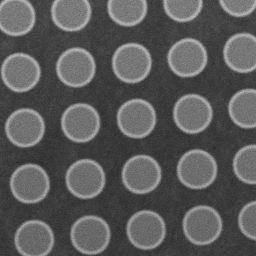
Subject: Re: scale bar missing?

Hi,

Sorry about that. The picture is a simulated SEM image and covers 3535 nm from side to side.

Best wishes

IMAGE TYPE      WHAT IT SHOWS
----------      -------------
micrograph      an array of small figures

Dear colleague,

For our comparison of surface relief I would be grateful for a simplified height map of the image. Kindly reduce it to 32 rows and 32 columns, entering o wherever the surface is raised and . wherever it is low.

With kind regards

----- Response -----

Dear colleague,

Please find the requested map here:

oooo...oooo..ooooo..ooooo...oooo
oooo..ooooo...oooo...oooo...ooo.
oooo...oooo...oooo....oo........
oooo...ooo......................
.............................ooo
................o.....ooo...oooo
........ooo...ooooo..ooooo..oooo
.ooo...ooooo..ooooo..ooooo..oooo
ooooo..ooooo..ooooo..oooo....ooo
ooooo..ooooo...ooo....oo........
.ooo....ooo.....................
..............................oo
................oo....oooo...ooo
.........ooo...oooo...oooo...ooo
.oooo...oooo...oooo...oooo...ooo
.oooo...oooo...oooo...oooo....oo
.oooo...oooo...oooo....oo.......
.oooo....oo.....................
..............................oo
.................oo....ooo...ooo
.........ooo....oooo..ooooo..ooo
..oooo..ooooo..ooooo..ooooo..ooo
.ooooo..ooooo..ooooo...oooo...oo
.ooooo..ooooo...ooo.....o.......
..oooo....oo....................
...............................o
.................oo....oooo...oo
..........ooo...oooo...ooooo..oo
..oooo...ooooo..ooooo..ooooo..oo
..ooooo..ooooo..ooooo..oooo....o
..ooooo..ooooo...ooo....oo......
..oooo....ooo...................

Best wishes